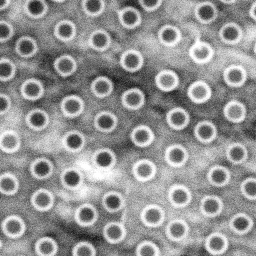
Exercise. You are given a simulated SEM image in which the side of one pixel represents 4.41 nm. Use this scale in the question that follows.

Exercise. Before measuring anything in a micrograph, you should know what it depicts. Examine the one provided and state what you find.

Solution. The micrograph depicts a regular array of raised bodies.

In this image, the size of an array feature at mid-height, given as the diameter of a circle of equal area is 19.7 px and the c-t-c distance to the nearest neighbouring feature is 148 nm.